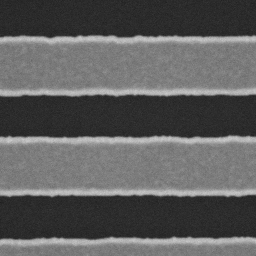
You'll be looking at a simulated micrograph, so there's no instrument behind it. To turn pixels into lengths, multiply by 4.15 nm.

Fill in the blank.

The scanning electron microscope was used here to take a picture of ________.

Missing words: lines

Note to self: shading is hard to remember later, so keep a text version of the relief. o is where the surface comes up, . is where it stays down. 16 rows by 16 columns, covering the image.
................
................
oooooooooooooooo
oooooooooooooooo
oooooooooooooooo
oooooooooooooooo
................
................
................
oooooooooooooooo
oooooooooooooooo
oooooooooooooooo
................
................
................
oooooooooooooooo